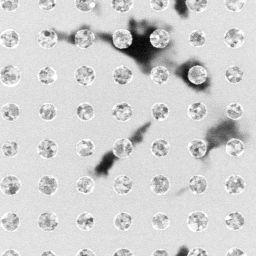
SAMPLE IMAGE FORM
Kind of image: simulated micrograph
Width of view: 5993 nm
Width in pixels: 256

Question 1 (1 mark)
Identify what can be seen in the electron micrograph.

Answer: a regular array of raised bodies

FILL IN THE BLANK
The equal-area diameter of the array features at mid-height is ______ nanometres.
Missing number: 427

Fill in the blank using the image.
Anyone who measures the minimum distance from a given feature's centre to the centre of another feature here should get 36.4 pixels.